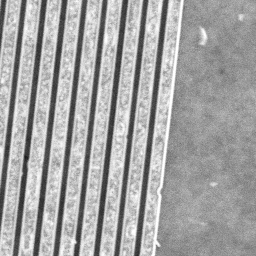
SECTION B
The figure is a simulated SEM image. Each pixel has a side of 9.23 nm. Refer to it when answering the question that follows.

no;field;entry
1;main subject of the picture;parallel lines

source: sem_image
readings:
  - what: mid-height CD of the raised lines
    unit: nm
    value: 115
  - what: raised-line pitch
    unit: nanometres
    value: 186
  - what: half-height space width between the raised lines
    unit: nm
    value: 65.4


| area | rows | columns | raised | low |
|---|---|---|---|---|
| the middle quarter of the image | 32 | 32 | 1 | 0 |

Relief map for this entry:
11001110001100111000111001110000
11001110011100111001110001110000
11001110011100111001110011100000
11001110011100111001110011100000
11001110011100111001110011100000
11001110011100111001110011100000
11001110011100111001110011100000
10001110011100111001110011100000
10011100011100110001110011100000
10011100011001110001100011100000
10011100111001110011100011100000
10011100111001110011100111000000
10011100111001110011100111000000
10011100111001110011100111000000
10011100111001110011100111000000
10011100111001110011100111000000
00011100111001110011100111000000
00111000111001110011100111000000
00111001110011100011000111000000
00111001110011100111000110000000
00111001110011100111001110000000
00111001110011100111001110000000
00111001110011100111001110000000
00111001110011100111001110000000
00111001110011100111001110000000
00111001110011100111001110000000
01110001110111100111001110000000
01110011100111101110001110000000
01110011100111001110001100000000
01110011100111001110011100000000
01110011100111001110011100000000
01110011100111001110011100000000